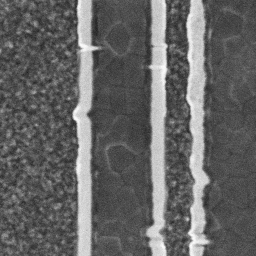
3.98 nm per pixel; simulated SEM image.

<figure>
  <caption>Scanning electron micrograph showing one or a few lines or trenches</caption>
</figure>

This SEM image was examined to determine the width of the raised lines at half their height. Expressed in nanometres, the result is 169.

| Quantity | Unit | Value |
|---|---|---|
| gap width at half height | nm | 279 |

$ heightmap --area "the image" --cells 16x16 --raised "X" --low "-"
XXXXX-----XX----
XXXXX-----XX----
XXXXX-----XX----
XXXXXX----XX----
XXXXX-----XX----
XXXXX-----XX----
XXXXX-----XX----
XXXXX-----XX----
XXXXX-----XX----
XXXXX-----XX----
XXXXX-----XX----
XXXXX-----XXX---
XXXXX-----XX----
XXXXX-----XXX---
XXXXX-----XX----
XXXXX-----XX----